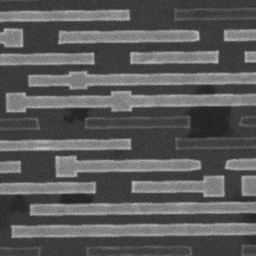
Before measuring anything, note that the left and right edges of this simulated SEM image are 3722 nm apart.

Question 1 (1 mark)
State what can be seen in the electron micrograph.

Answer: wiring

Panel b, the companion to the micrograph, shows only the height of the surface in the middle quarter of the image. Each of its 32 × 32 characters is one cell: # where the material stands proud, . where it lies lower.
................................
................................
.#####..........................
################################
################################
.#####..........................
................................
............#####...............
################################
################################
###################.............
............#####...............
................................
.................##############.
......#########################.
......#########################.
................................
................................
................................
################............####
################............####
................................
................................
###.............................
################################
################################
##############################..
###.............................
................................
............................####
########.........###############
########.........###############